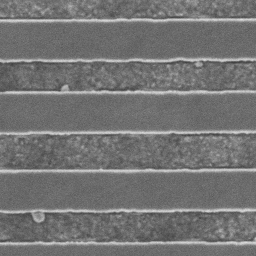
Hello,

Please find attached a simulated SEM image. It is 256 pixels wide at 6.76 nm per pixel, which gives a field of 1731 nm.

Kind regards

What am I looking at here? lines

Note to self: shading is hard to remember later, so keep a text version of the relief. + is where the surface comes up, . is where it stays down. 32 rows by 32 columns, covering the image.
................................
................................
...............++++..+++.+++.+++
++++++++++++++++++++++++++++++++
++++++++++++++++++++++++++++++++
++++++++++++++++++++++++++++++++
++++++++++++++++++++++++++++++++
++++++++++++++++++++++.+++++++.+
................................
................................
................................
++++++++++++++++++++++++++++++++
++++++++++++++++++++++++++++++++
++++++++++++++++++++++++++++++++
++++++++++++++++++++++++++++++++
++++++++++++++++++++++++++++++++
++++++++++++++++++++++++++++++++
................................
................................
................................
................................
++++++++++++++++++++++++++++++++
++++++++++++++++++++++++++++++++
++++++++++++++++++++++++++++++++
++++++++++++++++++++++++++++++++
++++++++++++++++++++++++++++++++
++++++..........................
................................
................................
................................
++++++++++++++++++++++++++++++++
++++++++++++++++++++++++++++++++